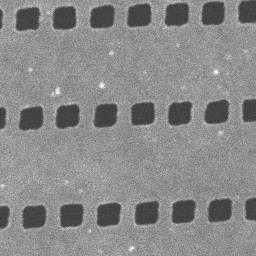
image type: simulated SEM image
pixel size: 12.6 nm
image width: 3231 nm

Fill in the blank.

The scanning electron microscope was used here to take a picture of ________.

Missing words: a regular array of holes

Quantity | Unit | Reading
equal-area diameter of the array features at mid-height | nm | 326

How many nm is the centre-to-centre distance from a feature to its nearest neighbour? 465